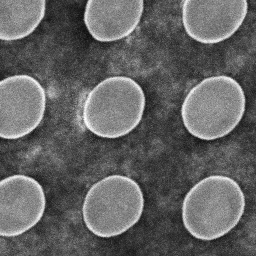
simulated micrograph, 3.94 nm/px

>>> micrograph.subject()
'raised bodies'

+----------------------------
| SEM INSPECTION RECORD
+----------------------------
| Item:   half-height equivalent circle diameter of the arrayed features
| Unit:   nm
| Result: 239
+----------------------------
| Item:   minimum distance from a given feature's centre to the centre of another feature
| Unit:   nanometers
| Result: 390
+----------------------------